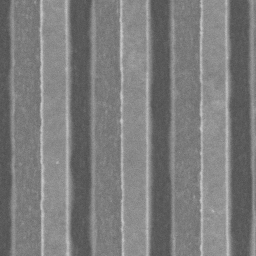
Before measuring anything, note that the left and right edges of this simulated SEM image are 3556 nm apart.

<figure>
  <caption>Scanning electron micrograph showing lines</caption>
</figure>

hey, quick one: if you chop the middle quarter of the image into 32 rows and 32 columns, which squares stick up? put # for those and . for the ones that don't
#.......#############......#####
#.......#############......#####
#.......#############......#####
#.......#############......#####
#.......#############.......####
#.......#############......#####
#.......#############......#####
#.......#############......#####
#.......#############.......####
#.......#############.......####
#.......#############.......####
#.......#############.......####
#.......#############.......####
#.......#############.......####
#.......#############......#####
#.......#############.......####
#.......#############.......####
#.......#############.......####
#.......#############.......####
#.......#############.......####
#.......#############.......####
#.......#############.......####
#.......#############.......####
#.......#############.......####
#.......#############.......####
#.......#############.......####
#.......#############.......####
#.......#############.......####
#.......#############.......####
#.......#############.......####
#.......#############.......####
#.......#############.......####